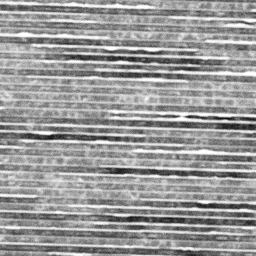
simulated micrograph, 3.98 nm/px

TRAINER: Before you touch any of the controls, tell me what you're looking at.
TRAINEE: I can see parallel lines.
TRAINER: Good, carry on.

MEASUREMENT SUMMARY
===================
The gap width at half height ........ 28.8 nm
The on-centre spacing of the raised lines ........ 63.5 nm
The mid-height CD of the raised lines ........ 34.8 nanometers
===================